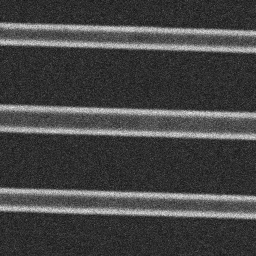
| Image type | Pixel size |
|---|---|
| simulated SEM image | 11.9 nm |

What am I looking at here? one or a few lines or trenches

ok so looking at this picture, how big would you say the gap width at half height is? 734 nm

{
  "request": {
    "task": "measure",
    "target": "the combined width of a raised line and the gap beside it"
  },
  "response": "982 nm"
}